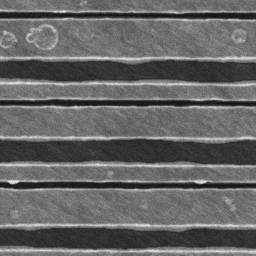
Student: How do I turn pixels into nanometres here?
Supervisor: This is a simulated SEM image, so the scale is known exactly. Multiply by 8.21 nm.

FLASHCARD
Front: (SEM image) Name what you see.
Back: lines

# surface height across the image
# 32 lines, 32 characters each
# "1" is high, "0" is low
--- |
11111111111111111111111111111111
11111111111111111111111111111111
11111111111111111111111111111111
11111111111111111111111111111111
11111111111111111111111111111111
11111111111111111111111111111111
11111111111111111111111111111111
00000000000000011100000000000000
00000000000000000000000000000000
00000000000000000000000000000000
11111111111111111111111111110111
11111111111111111111111111111111
11111111111111111111111111111111
11111111111111111111111111111111
11111111111111111111111111111111
11111111111111111111111111111111
11111111111111111111111111111111
00000000000000000000000011111000
00000000000000000000000000000000
00000000000000000000000000000000
11111000001111000000000000000000
11111111111111111111111111111111
11111111111111111111111111111111
11111111111111111111111111111111
11111111111111111111111111111111
11111111111111111111111111111111
11111111111111111111111111111111
11111111111111111111111111111111
00000000000000000000001000000000
00000000000000000000000000000000
00000000000000000000000000000000
11111111111111111111111111111111